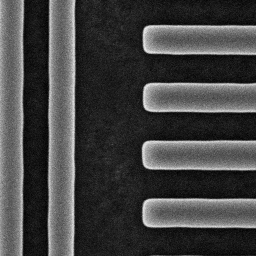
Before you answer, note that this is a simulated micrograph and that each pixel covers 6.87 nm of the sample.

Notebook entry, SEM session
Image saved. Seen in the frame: groups of lines, slits or small figures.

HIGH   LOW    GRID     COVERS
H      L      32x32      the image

HHHLLLHHHLLLLLLLLLLLLLLLLLLLLLLL
HHHLLLHHHLLLLLLLLLLLLLLLLLLLLLLL
HHHLLLHHHLLLLLLLLLLLLLLLLLLLLLLL
HHHLLLHHHLLLLLLLLLHHHHHHHHHHHHHH
HHHLLLHHHLLLLLLLLLHHHHHHHHHHHHHH
HHHLLLHHHLLLLLLLLLHHHHHHHHHHHHHH
HHHLLLHHHLLLLLLLLLHHHHHHHHHHHHHH
HHHLLLHHHLLLLLLLLLLLLLLLLLLLLLLL
HHHLLLHHHLLLLLLLLLLLLLLLLLLLLLLL
HHHLLLHHHLLLLLLLLLLLLLLLLLLLLLLL
HHHLLLHHHLLLLLLLLLLHHHHHHHHHHHLH
HHHLLLHHHLLLLLLLLLHHHHHHHHHHHHHH
HHHLLLHHHLLLLLLLLLHHHHHHHHHHHHHH
HHHLLLHHHLLLLLLLLLHHHHHHHHHHHHHH
HHHLLLHHHLLLLLLLLLLLLLLLLLLLLLLL
HHHLLLHHHLLLLLLLLLLLLLLLLLLLLLLL
HHHLLLHHHLLLLLLLLLLLLLLLLLLLLLLL
HHHLLLHHHLLLLLLLLLLLLLLLLLLLLLLL
HHHLLLHHHLLLLLLLLLHHHHHHHHHHHHHH
HHHLLLHHHLLLLLLLLLHHHHHHHHHHHHHH
HHHLLLHHHLLLLLLLLLHHHHHHHHHHHHHH
HHHLLLHHHLLLLLLLLLLLLLLLLLLLLLLL
HHHLLLHHHLLLLLLLLLLLLLLLLLLLLLLL
HHHLLLHHHLLLLLLLLLLLLLLLLLLLLLLL
HHHLLLHHHLLLLLLLLLLLLLLLLLLLLLLL
HHHLLLHHHLLLLLLLLLHHHHHHHHHHHHHH
HHHLLLHHHLLLLLLLLLHHHHHHHHHHHHHH
HHHLLLHHHLLLLLLLLLHHHHHHHHHHHHHH
HHHLLLHHHLLLLLLLLLLLLLLLLLLLLLLL
HHHLLLHHHLLLLLLLLLLLLLLLLLLLLLLL
HHHLLLHHHLLLLLLLLLLLLLLLLLLLLLLL
HHHLLLHHHLLLLLLLLLLLLLLLLLLLLLLL